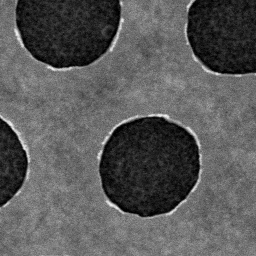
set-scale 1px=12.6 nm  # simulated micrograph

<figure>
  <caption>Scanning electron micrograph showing holes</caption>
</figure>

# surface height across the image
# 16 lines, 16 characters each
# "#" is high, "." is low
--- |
#.......####....
#......#####....
#......#####....
##....######....
##############..
################
################
########...#####
.######.....####
..####......####
..####......####
.#####......####
.######....#####
#########.######
################
################